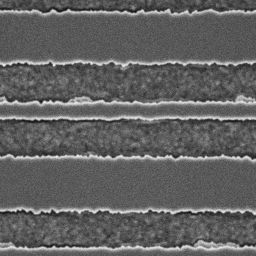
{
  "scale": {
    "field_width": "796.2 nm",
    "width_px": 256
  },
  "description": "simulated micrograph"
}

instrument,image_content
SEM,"lines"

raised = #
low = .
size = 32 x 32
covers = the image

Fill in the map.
................................
#####.#.########.#.###..###.####
################################
################################
################################
################################
################################
################################
................................
................................
................................
................................
................................
################################
################################
................................
................................
................................
................................
.#......##.#......#.............
################################
################################
################################
################################
################################
################################
....##.#...#..####.#.##.#...####
................................
................................
................................
................................
################################